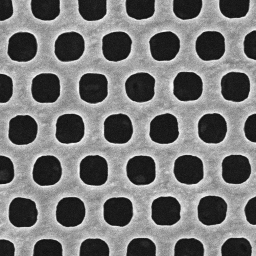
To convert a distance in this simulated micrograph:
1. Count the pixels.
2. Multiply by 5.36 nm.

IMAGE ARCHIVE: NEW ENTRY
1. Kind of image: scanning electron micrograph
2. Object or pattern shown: a regular array of holes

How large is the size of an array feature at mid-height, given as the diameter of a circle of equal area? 166 nanometers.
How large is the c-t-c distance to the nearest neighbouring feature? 252 nm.